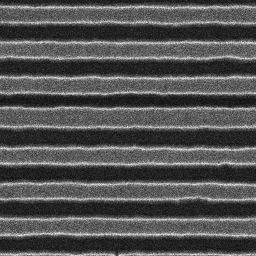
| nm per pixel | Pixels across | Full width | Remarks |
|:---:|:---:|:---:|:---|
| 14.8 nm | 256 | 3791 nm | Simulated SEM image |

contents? parallel lines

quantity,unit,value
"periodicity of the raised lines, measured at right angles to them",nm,523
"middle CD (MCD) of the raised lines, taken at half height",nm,292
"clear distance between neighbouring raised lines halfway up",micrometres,0.233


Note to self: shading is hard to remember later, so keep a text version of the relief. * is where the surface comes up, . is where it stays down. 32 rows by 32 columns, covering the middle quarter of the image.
................................
................................
................................
********************************
********************************
********************************
********************************
****************..**************
................................
................................
*******.........................
********************************
********************************
********************************
********************************
********************************
................................
................................
................................
................................
................................
********************************
********************************
********************************
********************************
...............***..............
................................
................................
................................
*****.........******.**.****.**.
********************************
********************************